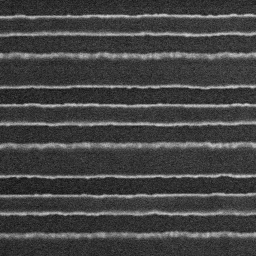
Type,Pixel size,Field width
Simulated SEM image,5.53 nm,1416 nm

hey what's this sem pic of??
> lines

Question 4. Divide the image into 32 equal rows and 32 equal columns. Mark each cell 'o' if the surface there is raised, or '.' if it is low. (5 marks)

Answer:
................................
................................
oooooooooooooooooooooooooooooooo
oooooooooooooooooooooooooooooooo
................................
................................
................................
oooooooooooooooooooooooooooooooo
oooooooooooooooooooooooooooooooo
oooooooooooooooooooooooooooooooo
oooooooooooooooooooooooooooooooo
................................
................................
oooooooooooooooooooooooooooooooo
oooooooooooooooooooooooooooooooo
oo..ooooooooo.oooooooooooo..oo..
................................
................................
oooooooooooooooooooooooooooooooo
oooooooooooooooooooooooooooooooo
oooooooooooooooooooooooooooooooo
oooooooooooooooooooooooooooooooo
................................
................................
oooooooooooooooooooooooooooooooo
oooooooooooooooooooooooooooooooo
oooooooooooooooooooooooooooooooo
................................
................................
oooooooooooooooooooooooooooooooo
oooooooooooooooooooooooooooooooo
oooooooooooooooooooooooooooooooo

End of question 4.